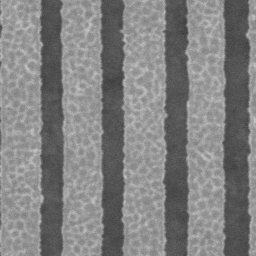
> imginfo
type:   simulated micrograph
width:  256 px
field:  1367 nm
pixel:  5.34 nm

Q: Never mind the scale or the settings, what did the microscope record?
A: one or a few lines or trenches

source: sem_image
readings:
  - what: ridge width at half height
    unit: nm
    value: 205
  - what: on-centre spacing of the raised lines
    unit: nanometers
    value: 330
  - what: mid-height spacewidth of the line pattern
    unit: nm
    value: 128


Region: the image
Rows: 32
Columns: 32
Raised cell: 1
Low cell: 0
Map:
11111000111110001111100111110001
11111000111110001111100011110001
11111000111110011111100111110001
11111000111110011111000111110001
11111000111100011111000011110001
11111000111110001111000011110001
11111000111110001111000111110001
11111000111110001111000011110001
11111000111110001111100111110001
11111000111110001111100011110001
11111000111110001111100011110001
11111000111110001111100011110001
11111000111110001111100011110001
11111000111110011111000111110001
11111000111110001111100111110001
11111000111110001111000111110001
11111000111110001111000011110001
11111000111110001111000011110001
11111000111110001111100111110001
11111000111110001111100111110001
11111000111110001111000111110001
11111000111110001111000011110001
11111000111110001111000111110001
11111000111110001111000011110001
11111000111110001111000011110001
11111000111110011111000111110001
11111000111110011111000011110001
11111000111110011111000011110000
11111000111110001111100011110001
11111000111110001111100011110001
11111000111110011111100011110001
11111000111110011111100011110001